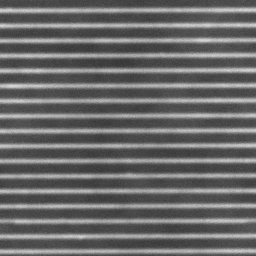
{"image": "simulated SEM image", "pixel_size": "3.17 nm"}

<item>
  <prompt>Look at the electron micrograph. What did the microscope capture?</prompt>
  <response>parallel lines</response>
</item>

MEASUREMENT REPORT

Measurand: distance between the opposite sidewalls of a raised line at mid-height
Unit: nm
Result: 9.1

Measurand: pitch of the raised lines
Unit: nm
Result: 47.7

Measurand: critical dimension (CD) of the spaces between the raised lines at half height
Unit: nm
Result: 40.4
